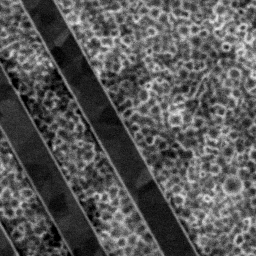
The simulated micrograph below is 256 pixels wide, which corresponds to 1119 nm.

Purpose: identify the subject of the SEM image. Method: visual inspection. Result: one or a few lines or trenches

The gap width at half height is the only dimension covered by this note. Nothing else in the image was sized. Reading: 209 nanometres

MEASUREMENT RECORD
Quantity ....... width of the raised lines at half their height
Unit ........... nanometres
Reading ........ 132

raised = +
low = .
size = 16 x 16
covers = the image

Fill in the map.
.+++............
..++............
...++...........
...++...........
....++..........
+...++..........
+....++.........
++...+++........
+++...++........
.++....++.......
.+++...++.......
..++....++......
...++...++......
...++....++.....
....++...+++....
+...++....++....